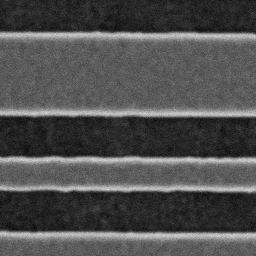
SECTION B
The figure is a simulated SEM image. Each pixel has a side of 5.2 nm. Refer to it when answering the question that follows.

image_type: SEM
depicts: lines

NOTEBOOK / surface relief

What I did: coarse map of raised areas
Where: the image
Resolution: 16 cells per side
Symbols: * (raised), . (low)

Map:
................
................
****************
****************
****************
****************
****************
................
................
................
****************
****************
................
................
................
****************